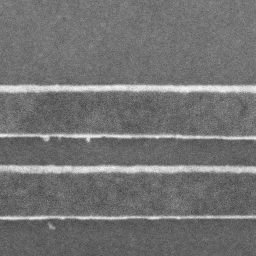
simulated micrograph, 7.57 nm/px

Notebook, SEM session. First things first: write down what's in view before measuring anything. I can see lines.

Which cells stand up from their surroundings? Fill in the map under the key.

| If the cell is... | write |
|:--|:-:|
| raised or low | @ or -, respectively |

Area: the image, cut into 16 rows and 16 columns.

----------------
----------------
----------------
----------------
----------------
---@--@@@@------
@@@@@@@@@@@@@@@@
@@@@@@@@@@@@@@@@
--@-@@@@@@@@@@@@
----------------
----------------
@@@@@@@@@@@@@@@@
@@@@@@@@@@@@@@@@
@@@@@@@@@@@@@@@@
----------------
----------------